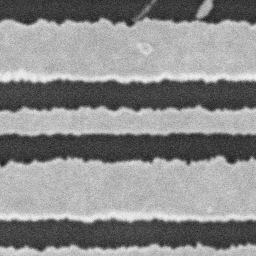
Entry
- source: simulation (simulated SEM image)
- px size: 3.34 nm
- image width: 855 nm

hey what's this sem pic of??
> lines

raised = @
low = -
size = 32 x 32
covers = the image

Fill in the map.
--------------------------------
--------------------------------
------------------@-------------
@@@@@@@@@@@@@@@@@@@@@@@@@@@@@@@@
@@@@@@@@@@@@@@@@@@@@@@@@@@@@@@@@
@@@@@@@@@@@@@@@@@@@@@@@@@@@@@@@@
@@@@@@@@@@@@@@@@@@@@@@@@@@@@@@@@
@@@@@@@@@@@@@@@@@@@@@@@@@@@@@@@@
@@@@@@@@@@@@@@@@@@@@@@@@@@@@@@@@
@@@@@@@@@@@@@@@@@@@@@@@@@@@@@@@@
--------------------------------
--------------------------------
--------------------------------
----------@-@-----------@-------
@@@@@@@@@@@@@@@@@@@@@@@@@@@@@@@@
@@@@@@@@@@@@@@@@@@@@@@@@@@@@@@@@
@@@@@@@@@@@@@@@@@@@@@@@@@@@@@@@@
--------------------------------
--------------------------------
--------------------------------
-@@-@@@@@@@@@@@@@@@@@@@@@@@@@@@@
@@@@@@@@@@@@@@@@@@@@@@@@@@@@@@@@
@@@@@@@@@@@@@@@@@@@@@@@@@@@@@@@@
@@@@@@@@@@@@@@@@@@@@@@@@@@@@@@@@
@@@@@@@@@@@@@@@@@@@@@@@@@@@@@@@@
@@@@@@@@@@@@@@@@@@@@@@@@@@@@@@@@
@@@@@@@@@@@@@@@@@@@@@@@@@@@@@@@@
----------@@-------------@@-----
--------------------------------
--------------------------------
--------------------------------
@@@@@@@@@@@@@@@@@@@@@@@@@@@@@@@@